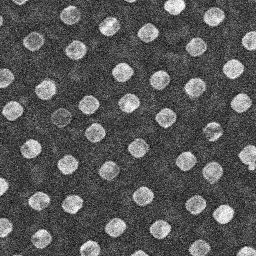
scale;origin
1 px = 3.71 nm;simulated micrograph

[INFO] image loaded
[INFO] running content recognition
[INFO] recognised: a regular array of raised bodies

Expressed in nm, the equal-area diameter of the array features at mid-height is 68.6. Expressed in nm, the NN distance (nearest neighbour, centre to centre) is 131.